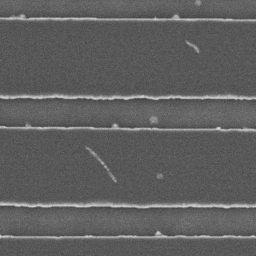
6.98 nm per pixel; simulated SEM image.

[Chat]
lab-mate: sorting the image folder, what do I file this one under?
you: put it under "lines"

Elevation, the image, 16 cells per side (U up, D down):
DDDDDDDDDDDDDDDD
UUUUUUUUUUUUUUUU
UUUUUUUUUUUUUUUU
UUUUUUUUUUUUUUUU
UUUUUUUUUUUUUUUU
UUUUUUUUUUUUUUUU
DDDDDDDDDDDDDDDD
DDDDDDDDDDDDDDDD
UUUUUUUUUUUUUUUU
UUUUUUUUUUUUUUUU
UUUUUUUUUUUUUUUU
UUUUUUUUUUUUUUUU
UUUUUUUUUUUUUUUU
DDDDDDDDDDDDDDDD
DDDDDDDDDDDDDDDD
UUUUUUUUUUUUUUUU